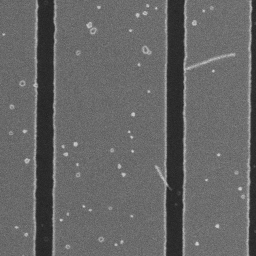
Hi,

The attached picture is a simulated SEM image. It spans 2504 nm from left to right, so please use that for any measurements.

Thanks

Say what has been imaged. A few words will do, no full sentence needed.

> lines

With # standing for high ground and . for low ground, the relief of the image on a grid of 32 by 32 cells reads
#####..##############..########.
#####..##############..########.
#####..##############..########.
#####..##############..########.
#####..##############..########.
#####..##############..########.
#####..##############..########.
#####..##############..########.
#####..##############..########.
#####..##############..########.
#####..##############..########.
#####..##############..########.
#####..##############..########.
#####..##############..########.
#####..##############..########.
#####..##############..########.
#####..##############..########.
#####..##############..########.
#####..##############..########.
####...##############..########.
#####..##############..########.
####...##############..########.
#####..##############..########.
#####..##############..########.
####...##############..########.
####...##############..########.
####...##############..########.
####...##############..########.
####...##############..########.
####...##############..########.
####...##############..########.
####...##############..########.